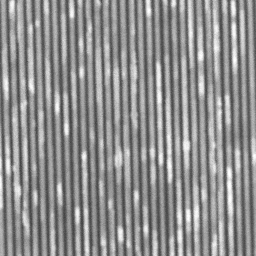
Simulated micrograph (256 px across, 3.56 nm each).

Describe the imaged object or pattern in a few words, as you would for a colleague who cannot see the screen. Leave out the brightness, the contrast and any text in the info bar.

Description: parallel lines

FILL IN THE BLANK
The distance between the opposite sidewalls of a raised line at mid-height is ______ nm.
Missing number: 13.8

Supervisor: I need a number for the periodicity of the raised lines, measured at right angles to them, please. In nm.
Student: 30.3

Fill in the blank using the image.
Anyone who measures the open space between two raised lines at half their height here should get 4.75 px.